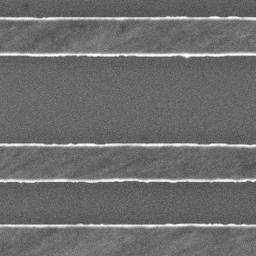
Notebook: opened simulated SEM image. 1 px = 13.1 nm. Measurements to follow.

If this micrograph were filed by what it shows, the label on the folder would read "lines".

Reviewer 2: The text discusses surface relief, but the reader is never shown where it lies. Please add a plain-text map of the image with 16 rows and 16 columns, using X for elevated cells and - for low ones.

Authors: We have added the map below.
----------------
XXXXXXXXXXXXXXXX
XXXXXXXXXXXXXXXX
----------------
----------------
----------------
----------------
----------------
----------------
XXXXXXXXXXXXXXXX
XXXXXXXXXXXXXXXX
----------------
----------------
----------------
XXXXXXXXXXXXXXXX
XXXXXXXXXXXXXXXX